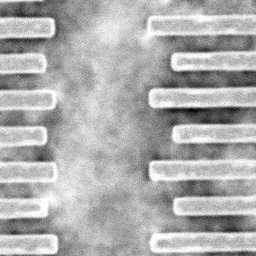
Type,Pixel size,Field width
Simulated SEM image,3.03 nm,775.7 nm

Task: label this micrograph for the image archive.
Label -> wiring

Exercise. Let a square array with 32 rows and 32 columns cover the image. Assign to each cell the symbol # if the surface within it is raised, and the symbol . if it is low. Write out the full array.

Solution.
................................
................................
######.............#############
#######............#############
######..........................
................................
................................
######................##########
######................##########
................................
................................
#######............#############
#######............#############
######..........................
................................
................................
######................##########
######................##########
................................
................................
#######............#############
#######............#############
#######.........................
................................
................................
######................##########
######................##########
................................
................................
....###............#############
#######............#############
#######.........................